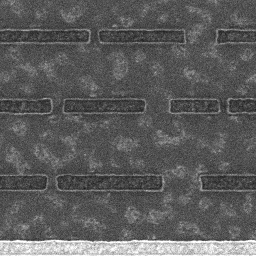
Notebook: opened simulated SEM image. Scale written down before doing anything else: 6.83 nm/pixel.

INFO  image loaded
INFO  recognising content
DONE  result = one or a few lines or trenches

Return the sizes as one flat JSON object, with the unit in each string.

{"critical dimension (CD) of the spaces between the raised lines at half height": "387 nm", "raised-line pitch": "498 nm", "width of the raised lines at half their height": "0.0913 µm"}